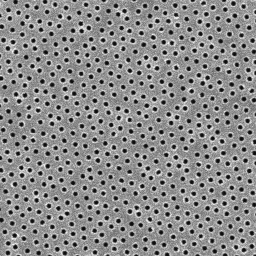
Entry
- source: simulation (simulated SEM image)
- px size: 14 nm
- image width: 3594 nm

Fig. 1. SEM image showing a regular array of holes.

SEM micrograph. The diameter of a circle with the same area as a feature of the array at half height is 0.0672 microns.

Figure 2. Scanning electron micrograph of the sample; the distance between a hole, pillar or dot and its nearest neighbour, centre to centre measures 134 nm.